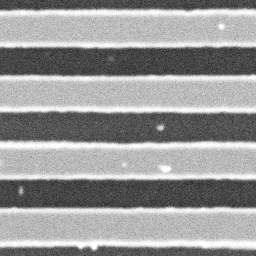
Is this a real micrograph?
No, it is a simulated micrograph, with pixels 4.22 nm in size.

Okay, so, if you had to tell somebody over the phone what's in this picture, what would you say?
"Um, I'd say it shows lines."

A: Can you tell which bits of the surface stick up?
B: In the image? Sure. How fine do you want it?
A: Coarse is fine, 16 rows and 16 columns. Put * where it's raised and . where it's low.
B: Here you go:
................
****************
****************
................
................
****************
****************
................
................
****************
****************
................
................
****************
****************
................